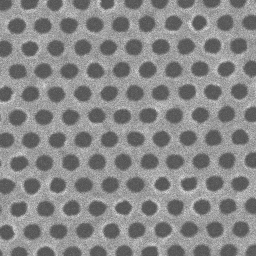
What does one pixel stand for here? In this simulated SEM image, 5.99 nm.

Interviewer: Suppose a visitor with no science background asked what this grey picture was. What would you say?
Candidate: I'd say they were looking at a regular array of holes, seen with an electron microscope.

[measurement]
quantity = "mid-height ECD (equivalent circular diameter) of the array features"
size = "101 nm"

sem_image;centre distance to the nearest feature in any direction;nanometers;154